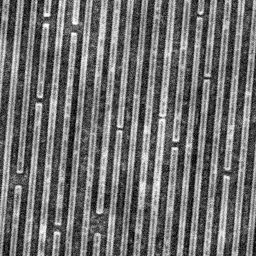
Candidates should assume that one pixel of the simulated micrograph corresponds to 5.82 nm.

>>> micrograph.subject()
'parallel lines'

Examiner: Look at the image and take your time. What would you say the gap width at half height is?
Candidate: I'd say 49.2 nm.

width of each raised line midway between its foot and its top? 0.0297 µm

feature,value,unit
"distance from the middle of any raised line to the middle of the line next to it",0.0804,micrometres